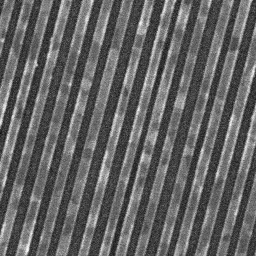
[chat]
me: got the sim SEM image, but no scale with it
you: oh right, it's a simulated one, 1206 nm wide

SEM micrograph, parallel lines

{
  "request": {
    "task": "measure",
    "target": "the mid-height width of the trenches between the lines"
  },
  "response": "46.7 nanometers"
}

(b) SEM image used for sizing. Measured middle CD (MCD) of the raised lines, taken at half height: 42.2 nm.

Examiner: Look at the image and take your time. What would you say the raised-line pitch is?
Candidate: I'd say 0.091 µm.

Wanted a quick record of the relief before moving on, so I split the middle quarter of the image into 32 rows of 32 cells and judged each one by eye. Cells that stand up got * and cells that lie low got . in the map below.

***...**..***...**...***.***..**
***..***..***...**...**..**...**
**...**...**....**...**..**...**
**...**...**...**....**.***...**
**...**..***...**...**..***..**.
**..***..***...**...**..**...**.
*...**...**...***...**..**...**.
*...**...**...**...***.***..***.
*..***..***...**...**..***..**..
*..**...***...**...**..**...**..
...**...**...***...**..**...**..
...**...**...**...***.***..**...
..***..***...**...**..***..**...
..**...**....**...**..**...**...
..**...**....**...**..**...**...
.***..***...**...***.***..**....
.***..***...**...**..***..**...*
.**...**....**...**..**...**...*
.**...**...***...**.***...**...*
.**..***...**...***.***..**....*
***..***...**...**..**...**...**
**...**....**...**..**...**...**
**...**...**....**.***...**...**
**..***...**...***.***..**....**
**..***...**...**..**...**...***
*...**....**...**..**...**...**.
*...**...**...***.***..***...**.
*..***...**...**..***..**....**.
...***...**...**..**...**...***.
...**....**...**..**...**...**..
...**...**...***.***..**....**..
..***...**...**..***..**...***..